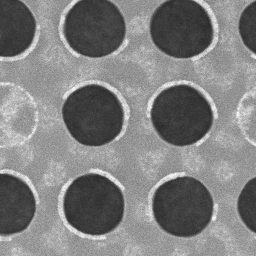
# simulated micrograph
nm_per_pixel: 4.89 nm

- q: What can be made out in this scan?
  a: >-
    holes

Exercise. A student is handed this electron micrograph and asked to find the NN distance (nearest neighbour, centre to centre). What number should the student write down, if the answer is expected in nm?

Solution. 433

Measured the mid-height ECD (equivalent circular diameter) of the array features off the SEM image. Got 0.3 µm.